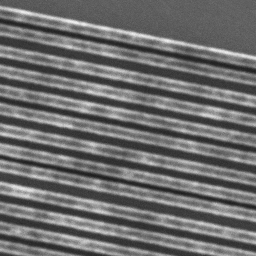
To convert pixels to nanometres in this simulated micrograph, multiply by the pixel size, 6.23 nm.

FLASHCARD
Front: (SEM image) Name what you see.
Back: parallel lines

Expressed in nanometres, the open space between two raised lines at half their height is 63.4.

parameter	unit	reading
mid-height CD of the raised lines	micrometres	0.0588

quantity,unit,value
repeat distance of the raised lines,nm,120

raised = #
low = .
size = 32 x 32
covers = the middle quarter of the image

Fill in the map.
#########...............########
...###########................##
........###########.............
.............###########........
####.............############...
#########..............#########
...###########.............#####
........############............
.............############.......
#####.............###########...
##########.............#########
...############.............####
.......#############............
#............############.......
#######...........############..
############...........#########
.....############...........####
..........###########...........
#..............###########......
######..............############
###########..............#######
....############..............##
........#############...........
#..............###########......
#######.............###########.
###########..............#######
....#############.............##
#.........###########...........
######.........############.....
###########........############.
....############.........#######
.........############..........#